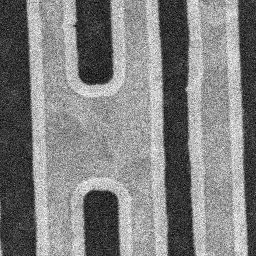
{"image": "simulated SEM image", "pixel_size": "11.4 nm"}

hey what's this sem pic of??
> one or a few lines or trenches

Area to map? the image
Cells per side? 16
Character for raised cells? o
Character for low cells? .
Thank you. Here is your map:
..oo...ooo..oo..
..oo...ooo..oo..
..oo...ooo..ooo.
..oo...ooo..ooo.
..oo...ooo..ooo.
..ooo..ooo..ooo.
..oooooooo..ooo.
..oooooooo..ooo.
..oooooooo..ooo.
..oooooooo..ooo.
...ooooooo..ooo.
...ooooooo..ooo.
...oo...oo..ooo.
...oo...oo..ooo.
...oo...oo..ooo.
...oo...oo...oo.